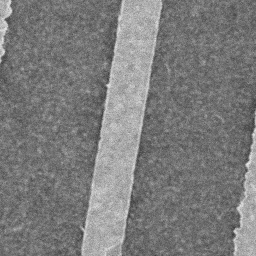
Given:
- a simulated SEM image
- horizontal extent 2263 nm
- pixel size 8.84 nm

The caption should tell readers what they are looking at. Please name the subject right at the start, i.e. one or a few lines or trenches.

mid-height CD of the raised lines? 340 nanometres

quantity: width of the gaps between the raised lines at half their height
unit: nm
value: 988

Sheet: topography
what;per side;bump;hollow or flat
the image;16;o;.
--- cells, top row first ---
o.......oo......
.......ooo......
.......ooo......
.......ooo......
.......oo.......
.......oo.......
.......oo.......
......ooo.......
......ooo.......
......ooo.......
......oo.......o
......oo.......o
......oo.......o
.....ooo.......o
.....ooo.......o
.....ooo.......o